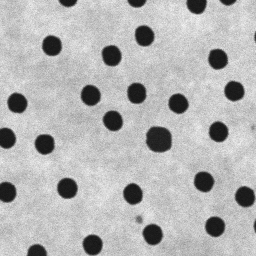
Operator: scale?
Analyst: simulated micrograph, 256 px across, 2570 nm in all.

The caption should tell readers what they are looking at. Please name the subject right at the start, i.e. a regular array of holes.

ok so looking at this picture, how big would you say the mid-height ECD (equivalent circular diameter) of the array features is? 0.209 microns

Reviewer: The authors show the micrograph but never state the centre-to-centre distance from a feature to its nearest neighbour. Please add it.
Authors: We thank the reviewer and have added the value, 43.8 pixels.